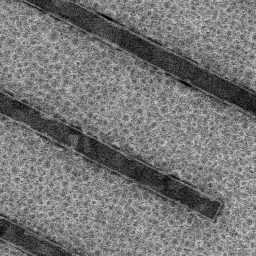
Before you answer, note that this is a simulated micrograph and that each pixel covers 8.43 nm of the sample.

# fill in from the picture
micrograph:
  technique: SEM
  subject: one or a few lines or trenches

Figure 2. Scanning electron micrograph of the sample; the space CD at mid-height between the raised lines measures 767 nanometers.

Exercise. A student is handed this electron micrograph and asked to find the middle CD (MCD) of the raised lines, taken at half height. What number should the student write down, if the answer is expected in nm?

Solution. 173